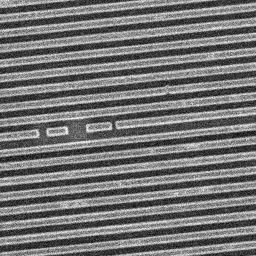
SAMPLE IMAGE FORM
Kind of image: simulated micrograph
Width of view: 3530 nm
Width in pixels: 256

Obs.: parallel lines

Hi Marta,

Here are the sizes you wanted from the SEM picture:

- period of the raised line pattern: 0.204 µm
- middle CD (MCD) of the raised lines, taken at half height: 0.0908 um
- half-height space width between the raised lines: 0.117 microns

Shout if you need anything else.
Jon